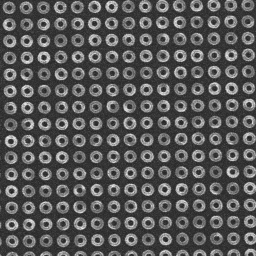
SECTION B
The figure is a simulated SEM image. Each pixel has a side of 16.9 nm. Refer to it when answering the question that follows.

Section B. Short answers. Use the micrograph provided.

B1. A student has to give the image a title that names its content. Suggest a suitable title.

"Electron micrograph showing a regular array of ring-shaped raised bodies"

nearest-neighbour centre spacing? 16.5 px